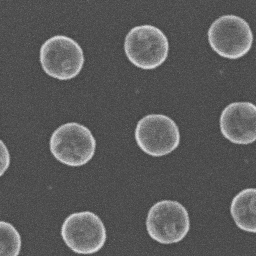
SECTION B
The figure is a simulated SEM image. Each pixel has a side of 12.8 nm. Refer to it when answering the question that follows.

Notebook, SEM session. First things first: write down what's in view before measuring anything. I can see raised bodies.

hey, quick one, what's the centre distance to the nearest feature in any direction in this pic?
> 1080 nm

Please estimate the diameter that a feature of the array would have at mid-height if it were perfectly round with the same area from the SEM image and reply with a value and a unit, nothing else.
534 nanometres